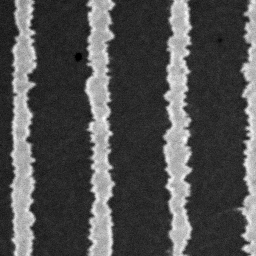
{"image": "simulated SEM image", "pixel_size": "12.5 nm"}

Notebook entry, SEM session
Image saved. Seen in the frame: one or a few lines or trenches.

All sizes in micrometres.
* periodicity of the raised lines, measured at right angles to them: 0.972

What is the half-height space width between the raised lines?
774 nanometers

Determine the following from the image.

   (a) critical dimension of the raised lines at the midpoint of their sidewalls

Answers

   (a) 0.197 micrometres